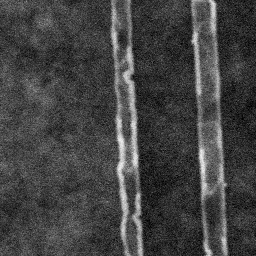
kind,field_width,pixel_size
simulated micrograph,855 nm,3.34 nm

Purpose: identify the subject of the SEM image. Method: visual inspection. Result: one or a few lines or trenches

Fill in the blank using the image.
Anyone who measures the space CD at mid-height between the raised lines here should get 62.1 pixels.